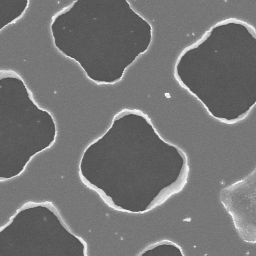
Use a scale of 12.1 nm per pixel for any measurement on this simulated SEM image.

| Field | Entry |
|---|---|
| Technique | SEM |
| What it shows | holes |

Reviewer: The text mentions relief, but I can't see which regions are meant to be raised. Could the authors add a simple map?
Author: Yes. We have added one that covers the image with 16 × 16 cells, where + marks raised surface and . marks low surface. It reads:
..++....++++++++
+++......+++++.+
+++......++++...
++++.....++.....
+++++...+++.....
..++++++++++....
..+++++++++++...
...++++..+++++++
...+++....++++++
..+++......+++++
.++++.......++++
++++++.....+++++
+++++++...++++++
+...++++++++++++
....++++++++++++
.....++++..+++++